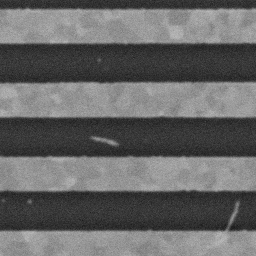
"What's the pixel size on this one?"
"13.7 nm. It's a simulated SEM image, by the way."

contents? lines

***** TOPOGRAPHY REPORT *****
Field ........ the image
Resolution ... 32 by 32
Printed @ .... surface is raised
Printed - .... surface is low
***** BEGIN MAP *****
--------------------------------
@@@@@@@@@@@@@@@@@@@@@@@@@@@@@@@@
@@@@@@@@@@@@@@@@@@@@@@@@@@@@@@@@
@@@@@@@@@@@@@@@@@@@@@@@@@@@@@@@@
@@@@@@@@@@@@@@@@@@@@@@@@@@@@@@@@
--------------------------------
--------------------------------
--------------------------------
--------------------------------
--------------------------------
-------@-@@@@--@@@@---@@@@@@@@@@
@@@@@@@@@@@@@@@@@@@@@@@@@@@@@@@@
@@@@@@@@@@@@@@@@@@@@@@@@@@@@@@@@
@@@@@@@@@@@@@@@@@@@@@@@@@@@@@@@@
@@@@@@@@@@@@@@@@@@@@@@-@@@@@@@@@
--------------------------------
--------------------------------
--------------------------------
--------------------------------
--------------------------------
@@@@@@@@@@@@@@@@@@@@@@@@@@@@@@@@
@@@@@@@@@@@@@@@@@@@@@@@@@@@@@@@@
@@@@@@@@@@@@@@@@@@@@@@@@@@@@@@@@
@@@@@@@@@@@@@@@@@@@@@@@@@@@@@@@@
--------------------------------
--------------------------------
--------------------------------
--------------------------------
--------------------------------
@@@@@@@@@@@@@@@@@@@@@@@@@@@@@@@@
@@@@@@@@@@@@@@@@@@@@@@@@@@@@@@@@
@@@@@@@@@@@@@@@@@@@@@@@@@@@@@@@@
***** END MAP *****